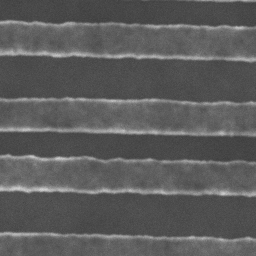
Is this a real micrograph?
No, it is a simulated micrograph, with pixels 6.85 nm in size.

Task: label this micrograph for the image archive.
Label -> lines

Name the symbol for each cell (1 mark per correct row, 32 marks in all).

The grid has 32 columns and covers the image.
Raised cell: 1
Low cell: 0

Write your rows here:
00000000000000000000000000000000
00000000000000000000000000000000
00000000000000000000000000000000
11111111111111111111111111111111
11111111111111111111111111111111
11111111111111111111111111111111
11111111111111111111111111111111
00000000000000000000000001001111
00000000000000000000000000000000
00000000000000000000000000000000
00000000000000000000000000000000
00000000000000000000000000000000
11111111111110000011000000000000
11111111111111111111111111111111
11111111111111111111111111111111
11111111111111111111111111111111
00000000000111111111111111111111
00000000000000000000000000000000
00000000000000000000000000000000
11010000000000000000000000000000
11111111111111111111111111111111
11111111111111111111111111111111
11111111111111111111111111111111
11111111111111111111111111111111
00000000000000000000000000000001
00000000000000000000000000000000
00000000000000000000000000000000
00000000000000000000000000000000
00000000000000000000000000000000
11111111111110100000000000000000
11111111111111111111111111111111
11111111111111111111111111111111